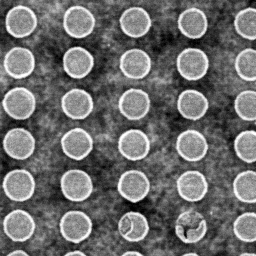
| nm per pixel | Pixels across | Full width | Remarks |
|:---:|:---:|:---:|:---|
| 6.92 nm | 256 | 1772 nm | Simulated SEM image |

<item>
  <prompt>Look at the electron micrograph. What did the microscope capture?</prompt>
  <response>a regular array of raised bodies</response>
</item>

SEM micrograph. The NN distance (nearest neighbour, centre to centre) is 40.5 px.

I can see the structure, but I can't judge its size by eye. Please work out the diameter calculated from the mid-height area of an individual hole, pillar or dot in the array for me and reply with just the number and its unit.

203 nm